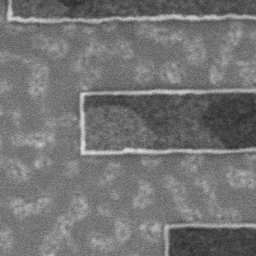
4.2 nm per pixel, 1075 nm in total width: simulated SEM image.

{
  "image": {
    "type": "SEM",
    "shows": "one or a few lines or trenches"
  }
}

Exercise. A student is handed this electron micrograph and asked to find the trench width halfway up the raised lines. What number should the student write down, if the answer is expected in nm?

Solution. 310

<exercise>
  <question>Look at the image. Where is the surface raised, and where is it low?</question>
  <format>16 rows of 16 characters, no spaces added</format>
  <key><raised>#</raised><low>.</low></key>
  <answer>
.###############
................
................
................
................
................
.....###########
.....###########
.....###########
......##.#......
................
................
................
................
..........######
..........######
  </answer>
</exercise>